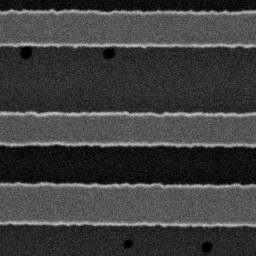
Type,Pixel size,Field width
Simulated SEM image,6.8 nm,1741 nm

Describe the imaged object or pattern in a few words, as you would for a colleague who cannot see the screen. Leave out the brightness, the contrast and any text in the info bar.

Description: lines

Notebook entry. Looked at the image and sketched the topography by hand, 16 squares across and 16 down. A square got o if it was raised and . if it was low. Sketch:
................
oooooooooooooooo
oooooooooooooooo
................
................
................
................
oooooooooooooooo
oooooooooooooooo
................
................
................
oooooooooooooooo
oooooooooooooooo
................
................